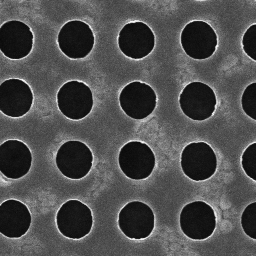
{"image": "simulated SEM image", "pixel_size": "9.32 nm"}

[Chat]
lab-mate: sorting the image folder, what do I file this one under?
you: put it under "a regular array of holes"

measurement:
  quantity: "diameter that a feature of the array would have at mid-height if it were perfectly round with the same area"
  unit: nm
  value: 347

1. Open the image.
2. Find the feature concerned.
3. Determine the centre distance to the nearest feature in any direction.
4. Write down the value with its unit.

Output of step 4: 0.558 microns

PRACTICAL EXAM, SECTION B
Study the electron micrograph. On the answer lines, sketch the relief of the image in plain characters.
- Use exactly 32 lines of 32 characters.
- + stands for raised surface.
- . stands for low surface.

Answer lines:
++++++++++++++++++++++++++++++++
++++++++++++++++++++++++++++++++
++++++++++++++++++++++++++++++++
....++++...++++....++++...+++++.
....+++.....+++....++++....+++..
....+++.....+++....++++....+++..
....++++...++++....++++....++++.
++++++++++++++++++++++++++++++++
++++++++++++++++++++++++++++++++
++++++++++++++++++++++++++++++++
...+++++...+++++..++++++..+++++.
....+++....++++....++++....+++..
....+++.....+++.....++.....+++..
....+++.....+++....++++....+++..
+..+++++...+++++..+++++...+++++.
++++++++++++++++++++++++++++++++
++++++++++++++++++++++++++++++++
+.++++++++++++++++++++++++++++++
...++++....++++....++++...+++++.
....+++.....+++....++++....+++..
....+++....++++....++++....+++..
...+++++...++++....++++....++++.
++++++++++++++++++++++++.+++++++
++++++++++++++++++++++++++++++++
++++++++++++++++++++++++++++++++
...+++++..++++++..++++++..+++++.
....+++....++++....++++....+++..
....+++.....+++....++++....+++..
....+++....++++....++++....+++..
+..+++++...+++++..+++++...+++++.
++++++++++++++++++++++++++++++++
++++++++++++++++++++++++++++++++